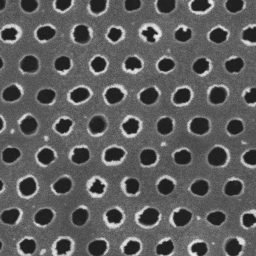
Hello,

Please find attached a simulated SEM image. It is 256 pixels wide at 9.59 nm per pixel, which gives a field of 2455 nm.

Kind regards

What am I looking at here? a regular array of holes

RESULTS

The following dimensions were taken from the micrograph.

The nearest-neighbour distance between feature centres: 323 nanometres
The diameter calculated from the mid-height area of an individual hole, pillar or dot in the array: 157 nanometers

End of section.